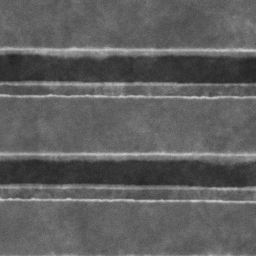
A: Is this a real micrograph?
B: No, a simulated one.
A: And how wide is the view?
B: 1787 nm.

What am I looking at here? lines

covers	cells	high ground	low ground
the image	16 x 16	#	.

################
################
################
................
................
################
################
################
################
################
................
................
################
################
################
################